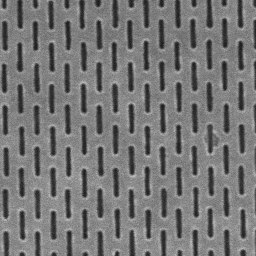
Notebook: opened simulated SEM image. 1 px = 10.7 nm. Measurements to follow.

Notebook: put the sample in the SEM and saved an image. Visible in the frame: a regular array of holes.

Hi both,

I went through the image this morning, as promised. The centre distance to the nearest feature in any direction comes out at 272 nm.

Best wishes